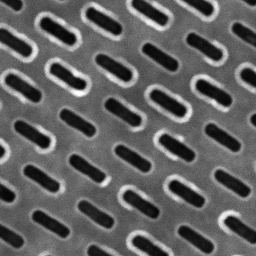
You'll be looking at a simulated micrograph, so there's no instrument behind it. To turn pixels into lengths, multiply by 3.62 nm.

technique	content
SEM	a regular array of holes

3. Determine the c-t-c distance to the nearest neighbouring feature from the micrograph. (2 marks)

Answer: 167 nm